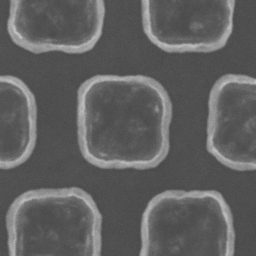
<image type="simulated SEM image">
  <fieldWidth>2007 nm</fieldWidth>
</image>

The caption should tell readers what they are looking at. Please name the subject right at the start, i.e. raised bodies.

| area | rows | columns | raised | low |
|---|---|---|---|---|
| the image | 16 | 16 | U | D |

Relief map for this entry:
DUUUUUDDDUUUUUDD
DUUUUUDDDUUUUUDD
DUUUUUDDDDUUUUDD
DDDDDDDDDDDDDDDD
DDDDDDDDDDDDDDDD
UDDDDUUUUUDDDDUU
UUDDDUUUUUDDDUUU
UUDDDUUUUUDDDUUU
UUDDDUUUUUDDDUUU
UUDDDUUUUUDDDUUU
DDDDDDDDDDDDDDDD
DDDDDDDDDDDDDDDD
DUUUUDDDDDUUUUDD
DUUUUUDDDUUUUUDD
DUUUUUDDDUUUUUDD
DUUUUUDDDUUUUUDD